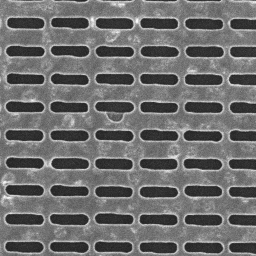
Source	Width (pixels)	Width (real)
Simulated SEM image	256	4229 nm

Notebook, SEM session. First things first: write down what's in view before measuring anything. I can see a regular array of holes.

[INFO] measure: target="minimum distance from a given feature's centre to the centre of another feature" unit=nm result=458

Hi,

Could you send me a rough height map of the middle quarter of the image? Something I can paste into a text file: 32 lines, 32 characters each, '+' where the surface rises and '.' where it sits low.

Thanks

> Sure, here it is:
++++++++++++++++++++++++++++++++
++++++++++++++++++++++++++++++++
+++++++++.......++++.......++++.
......++.........++..........+..
......++.........++.........++..
++++++++++++++++++++++++++++++++
++++++++++++++++++++++++++++++++
++++++++++++++++++++++++++++++++
++++++++++++++++++++++++++++++++
.++++++++.......++++...++++++++.
......++.........++.........++..
......++.........++.........++..
+++++++++++....+++++++++++++++++
+++++++++++....+++++++++++++++++
+++++++++++++.++++++++++++++++++
++++++++++++++++++++++++++++++++
.....+++++++++++++++...++++++++.
......++.........++..........+..
......++.........++..........+..
+++++++++++++++.++++++++++++++++
++++++++++++++++++++++++++++++++
++++++++++++++++++++++++++++++++
++++++++++++++++++++++++++++++++
....+++++.....++++++++++++++++++
......++.........++.........++..
......++.........++.........++..
++++++++++++++++++++++.....+++++
++++++++++++++++++++++++++++++++
++++++++++++++++++++++++++++++++
++++++++++++++++++++++++++++++++
.....++++......++++++++++++++++.
......++.........++.........++..